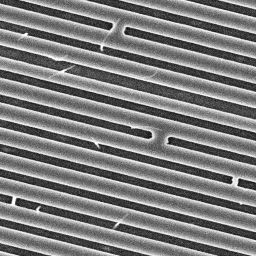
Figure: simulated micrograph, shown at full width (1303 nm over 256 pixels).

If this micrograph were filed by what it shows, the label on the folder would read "parallel lines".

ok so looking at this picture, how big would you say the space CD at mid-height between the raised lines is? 43.8 nanometers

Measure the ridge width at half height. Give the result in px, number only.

15.5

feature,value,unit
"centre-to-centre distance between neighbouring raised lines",0.122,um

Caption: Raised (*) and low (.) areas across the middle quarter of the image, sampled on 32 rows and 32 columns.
.....****************.........**
.........****************.......
*............****************...
*****............***************
*********............***********
.************............*******
.....*************...........***
.........*************..........
****.........*************......
********.........*************..
************.........***********
****************.........*******
....****************.........***
........****************........
***.........****************....
*******.........****************
***********.........************
***************.......**********
...****************...****..****
.......*******************......
**.........****************.....
******.........****************.
**********.........*************
**************.........*********
...***************.........*****
.......***************.........*
**.........****************.....
******.........***************..
**********.........*************
**************.........*********
..****************.........*****
......****************.........*